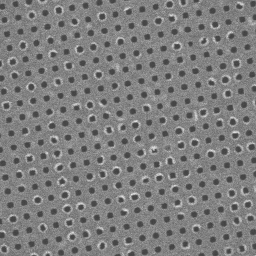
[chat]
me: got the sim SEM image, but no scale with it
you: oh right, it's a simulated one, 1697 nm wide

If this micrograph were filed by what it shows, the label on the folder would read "a regular array of holes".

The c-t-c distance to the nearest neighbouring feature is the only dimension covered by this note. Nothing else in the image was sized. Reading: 89.7 nanometres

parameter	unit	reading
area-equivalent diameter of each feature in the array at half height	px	6.38